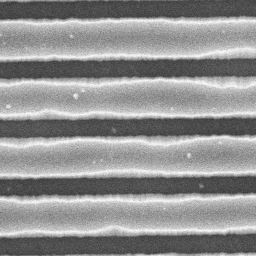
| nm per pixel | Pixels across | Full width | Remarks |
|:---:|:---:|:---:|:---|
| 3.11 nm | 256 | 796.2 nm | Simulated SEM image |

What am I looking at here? lines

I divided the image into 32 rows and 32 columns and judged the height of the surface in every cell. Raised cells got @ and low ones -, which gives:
--------------------------------
--------------------------------
--@----@@@@@@@@@@@@@@@@@@@@@@@@@
@@@@@@@@@@@@@@@@@@@@@@@@@@@@@@@@
@@@@@@@@@@@@@@@@@@@@@@@@@@@@@@@@
@@@@@@@@@@@@@@@@@@@@@@@@@@@@@@@@
@@@@@@@@@@@@@@@@@@@@@@@@@@@@@@@@
@-------------------------------
--------------------------------
--------------------------------
@@@@@@@@@@@@@@@@@@@@@@@@@@@@@@@@
@@@@@@@@@@@@@@@@@@@@@@@@@@@@@@@@
@@@@@@@@@@@@@@@@@@@@@@@@@@@@@@@@
@@@@@@@@@@@@@@@@@@@@@@@@@@@@@@@@
@@@@@@@@@@@@@@@@@@@@@@@@@@@@@@@@
--------------------------------
--------------------------------
----@@@@@@@@@@@@@@@@@@@@@@@@@@@@
@@@@@@@@@@@@@@@@@@@@@@@@@@@@@@@@
@@@@@@@@@@@@@@@@@@@@@@@@@@@@@@@@
@@@@@@@@@@@@@@@@@@@@@@@@@@@@@@@@
@@@@@@@@@@@@@@@@@@@@@@@@@@@@@@@@
--------------------------------
--------------------------------
-----------------------@@@@@@@@@
@@@@@@@@@@@@@@@@@@@@@@@@@@@@@@@@
@@@@@@@@@@@@@@@@@@@@@@@@@@@@@@@@
@@@@@@@@@@@@@@@@@@@@@@@@@@@@@@@@
@@@@@@@@@@@@@@@@@@@@@@@@@@@@@@@@
--------------------------------
--------------------------------
--------------------------------